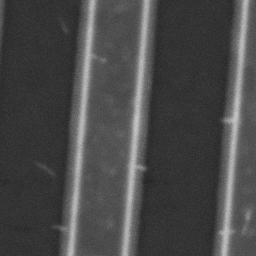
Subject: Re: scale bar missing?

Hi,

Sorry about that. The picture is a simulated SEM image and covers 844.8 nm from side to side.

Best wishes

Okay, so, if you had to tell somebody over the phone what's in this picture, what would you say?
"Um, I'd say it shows one or a few lines or trenches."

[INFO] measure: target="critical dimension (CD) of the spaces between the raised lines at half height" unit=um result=0.324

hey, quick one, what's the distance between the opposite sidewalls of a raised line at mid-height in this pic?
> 177 nm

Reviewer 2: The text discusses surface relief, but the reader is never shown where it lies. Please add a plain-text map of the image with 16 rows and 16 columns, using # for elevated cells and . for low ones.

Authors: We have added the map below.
......###......#
......###......#
......###......#
.....####......#
.....####......#
.....####......#
.....####......#
.....####......#
.....###.......#
.....###.......#
.....###......##
.....###......##
.....###......##
.....###......##
.....###......##
....####......##